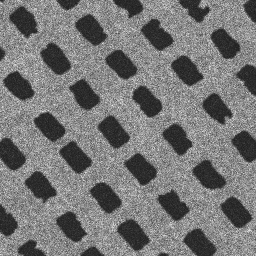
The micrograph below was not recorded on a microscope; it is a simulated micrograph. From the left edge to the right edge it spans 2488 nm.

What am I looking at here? a regular array of holes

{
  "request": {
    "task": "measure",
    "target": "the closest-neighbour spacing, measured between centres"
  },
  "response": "443 nanometers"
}